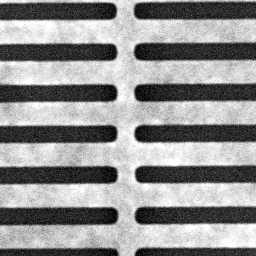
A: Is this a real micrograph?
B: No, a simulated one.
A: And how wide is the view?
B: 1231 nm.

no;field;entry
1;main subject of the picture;groups of lines, slits or small figures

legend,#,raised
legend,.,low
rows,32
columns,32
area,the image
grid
..............###...............
...............##...............
..............###...............
################################
################################
..............###...............
...............##...............
..............###...............
################################
################################
#.............####..............
...............##...............
..............###...............
################################
################################
########################........
...............##...............
...............##...............
################################
################################
################################
...............##...............
...............##...............
################################
################################
################################
...............##...............
...............##...............
################################
################################
################################
...............##...............